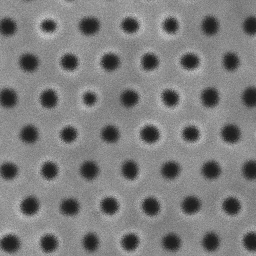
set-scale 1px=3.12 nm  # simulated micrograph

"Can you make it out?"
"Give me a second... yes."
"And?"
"a regular array of holes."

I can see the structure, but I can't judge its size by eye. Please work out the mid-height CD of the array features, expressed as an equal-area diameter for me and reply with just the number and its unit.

0.0558 microns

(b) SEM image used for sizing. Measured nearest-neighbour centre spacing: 125 nanometers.